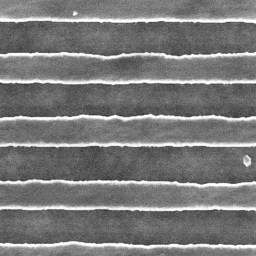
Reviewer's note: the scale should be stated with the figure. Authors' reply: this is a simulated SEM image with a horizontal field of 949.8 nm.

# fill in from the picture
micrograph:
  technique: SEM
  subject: lines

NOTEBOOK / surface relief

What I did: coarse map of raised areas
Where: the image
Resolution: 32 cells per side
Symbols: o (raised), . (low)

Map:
oooooooooooooooooooooooooooooooo
oooooooooooooooooooooooooooooooo
oooo.ooooooooooooooooooooooooooo
................................
................................
................................
................................
oooooooooooooooooooooooooooooooo
oooooooooooooooooooooooooooooooo
oooooooooooooooooooooooooooooooo
................................
................................
................................
................................
..........o.......o.............
oooooooooooooooooooooooooooooooo
oooooooooooooooooooooooooooooooo
oooooooooooooooooooooooooooooooo
................................
................................
................................
................................
................................
oooooooooooooooooooooooooooooooo
oooooooooooooooooooooooooooooooo
oooooooooooooooooooooooooooooooo
................................
................................
................................
................................
o......oooo..oo.................
oooooooooooooooooooooooooooooooo